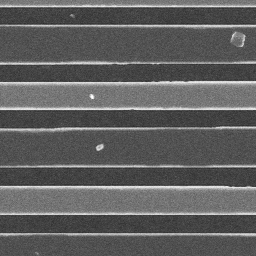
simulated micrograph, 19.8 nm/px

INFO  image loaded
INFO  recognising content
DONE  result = lines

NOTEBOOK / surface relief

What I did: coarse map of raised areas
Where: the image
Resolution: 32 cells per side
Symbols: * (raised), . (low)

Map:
********************************
................................
................................
********************************
********************************
********************************
********************************
********************************
................................
................................
********************************
********************************
********************************
********************************
................................
................................
********************************
********************************
********************************
********************************
********************************
................................
................................
********************************
********************************
********************************
********************************
................................
................................
********************************
********************************
********************************